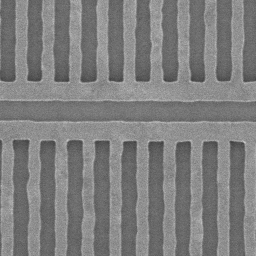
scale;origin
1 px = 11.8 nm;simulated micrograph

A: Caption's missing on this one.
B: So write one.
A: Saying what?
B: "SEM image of groups of lines, slits or small figures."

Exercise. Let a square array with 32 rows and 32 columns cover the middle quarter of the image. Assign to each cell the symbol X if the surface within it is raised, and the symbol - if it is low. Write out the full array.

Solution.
-XXX----XXX----XX-----XX-----XX-
-XXX----XXX----XX-----XX-----XX-
-XXX----XXX----XXX----XXX----XX-
-XXX----XXX----XXX----XXX----XX-
-XXX----XXXXX-XXXX---XXXX--XXXXX
XXXXXXXXXXXXXXXXXXXXXXXXXXXXXXXX
XXXXXXXXXXXXXXXXXXXXXXXXXXXXXXXX
XXXXXXXXXXXXXXXXXXXXXXXXXXXXXXXX
XXXXXXXXXXXXXXXXXXXXXXXXXXXXXXXX
--------------------------------
--------------------------------
--------------------------------
--------------------------------
--------------------------------
-----------XXXX-----------------
XXXXXXXXXXXXXXXXXXXXXXXXXXXXXXXX
XXXXXXXXXXXXXXXXXXXXXXXXXXXXXXXX
XXXXXXXXXXXXXXXXXXXXXXXXXXXXXXXX
XXXXXXXXXXXXXXXXXXXXXXXXXXXXXXXX
X----XXX----XXX---XXX----XXXX---
X----XXX----XXX---XXX----XXX----
X----XXX----XXX---XXX----XXX----
X----XXX----XX----XXX----XXX----
X----XXX---XXX----XXX----XXX----
X----XX----XXX----XXX----XXX----
X----XX-----XX----XXX----XXX----
X----XX-----XX----XXX----XXX----
X----XX-----XX----XXX----XXX----
X----XX-----XX----XXX----XXX----
X----XX-----XX----XXX----XXX----
X----XX-----XX----XXX----XXX----
X----XX-----XX-----XX----XXX----